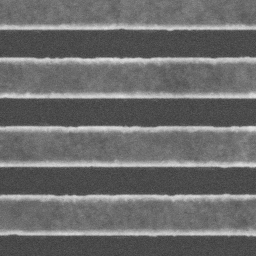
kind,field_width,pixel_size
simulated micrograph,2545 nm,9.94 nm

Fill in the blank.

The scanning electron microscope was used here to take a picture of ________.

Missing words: lines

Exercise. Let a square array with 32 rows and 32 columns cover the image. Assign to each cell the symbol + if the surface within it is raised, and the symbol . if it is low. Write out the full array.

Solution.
++++++++++++++++++++++++++++++++
++++++++++++++++++++++++++++++++
++++++++++++++++++++++++++++++++
++++++++++++++++++++++++++++++++
................................
................................
................................
++++++++++++++++++++++++++++++++
++++++++++++++++++++++++++++++++
++++++++++++++++++++++++++++++++
++++++++++++++++++++++++++++++++
++++++++++++++++++++++++++++++++
................................
................................
................................
................................
++++++++++++++++++++++++++++++++
++++++++++++++++++++++++++++++++
++++++++++++++++++++++++++++++++
++++++++++++++++++++++++++++++++
++++++++++++++++++++++++++++++++
................................
................................
................................
..+...............+.........+.++
++++++++++++++++++++++++++++++++
++++++++++++++++++++++++++++++++
++++++++++++++++++++++++++++++++
++++++++++++++++++++++++++++++++
................................
................................
................................